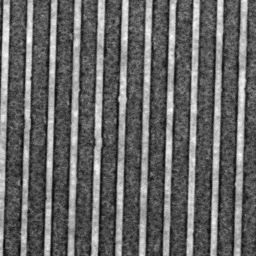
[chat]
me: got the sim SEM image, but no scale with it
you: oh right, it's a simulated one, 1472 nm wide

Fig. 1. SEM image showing parallel lines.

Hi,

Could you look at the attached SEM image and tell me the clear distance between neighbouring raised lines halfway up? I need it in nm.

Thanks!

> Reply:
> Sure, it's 102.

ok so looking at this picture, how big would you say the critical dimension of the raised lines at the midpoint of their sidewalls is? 32.3 nm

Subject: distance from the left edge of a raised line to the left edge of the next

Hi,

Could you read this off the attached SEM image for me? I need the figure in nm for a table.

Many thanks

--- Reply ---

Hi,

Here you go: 136